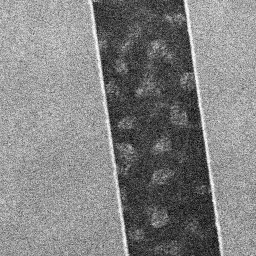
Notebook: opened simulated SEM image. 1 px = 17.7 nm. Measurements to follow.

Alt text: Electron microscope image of one or a few lines or trenches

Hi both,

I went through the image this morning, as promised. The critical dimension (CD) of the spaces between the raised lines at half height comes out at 94.1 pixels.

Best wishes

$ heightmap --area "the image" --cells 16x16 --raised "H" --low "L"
HHHHHHLLLLLLHHHH
HHHHHHLLLLLLHHHH
HHHHHHLLLLLLHHHH
HHHHHHLLLLLLHHHH
HHHHHHLLLLLLHHHH
HHHHHHLLLLLLHHHH
HHHHHHHLLLLLHHHH
HHHHHHHLLLLLLHHH
HHHHHHHLLLLLLHHH
HHHHHHHLLLLLLHHH
HHHHHHHLLLLLLHHH
HHHHHHHLLLLLLHHH
HHHHHHHLLLLLLHHH
HHHHHHHHLLLLLLHH
HHHHHHHHLLLLLLHH
HHHHHHHHLLLLLLHH